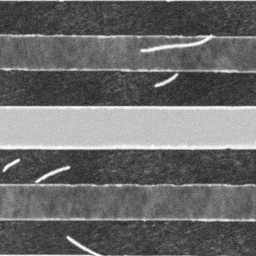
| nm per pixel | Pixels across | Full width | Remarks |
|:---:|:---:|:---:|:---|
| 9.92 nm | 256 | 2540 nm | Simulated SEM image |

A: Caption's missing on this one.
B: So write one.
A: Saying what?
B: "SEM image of lines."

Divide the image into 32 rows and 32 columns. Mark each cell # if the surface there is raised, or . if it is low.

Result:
................................
................................
................................
................................
########.#......................
################################
################################
################################
################################
................................
................................
................................
................................
#############################.##
################################
################################
################################
################################
......###.......................
................................
................................
................................
................................
################################
################################
################################
################################
.........................#######
................................
................................
................................
................................